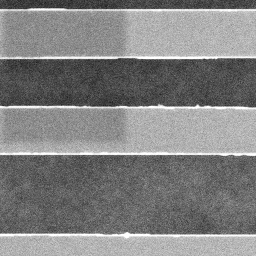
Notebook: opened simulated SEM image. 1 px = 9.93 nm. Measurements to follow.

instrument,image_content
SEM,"lines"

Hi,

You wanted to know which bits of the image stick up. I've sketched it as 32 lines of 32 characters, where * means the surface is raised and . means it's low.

................................
********************************
********************************
********************************
********************************
********************************
********************************
................................
................................
................................
................................
................................
................................
*******************************.
********************************
********************************
********************************
********************************
********************************
................................
................................
................................
................................
................................
................................
................................
................................
................................
................................
********************************
********************************
********************************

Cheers